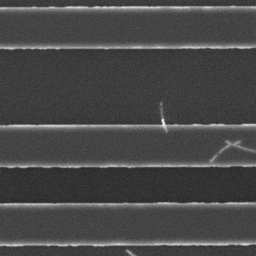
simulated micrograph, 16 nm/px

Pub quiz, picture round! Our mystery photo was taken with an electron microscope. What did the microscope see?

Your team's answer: lines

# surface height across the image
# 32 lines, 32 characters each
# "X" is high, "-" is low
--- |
--------------------------------
XXXXXXXXXXXXXXXXXXXXXXXXXXXXXXXX
XXXXXXXXXXXXXXXXXXXXXXXXXXXXXXXX
XXXXXXXXXXXXXXXXXXXXXXXXXXXXXXXX
XXXXXXXXXXXXXXXXXXXXXXXXXXXXXXXX
XXXXXXXXXXXXXXXXXXXXXXXXXXXXXXXX
--------------------------------
--------------------------------
--------------------------------
--------------------------------
--------------------------------
--------------------------------
--------------------------------
--------------------------------
--------------------------------
--------------------------------
XXXXXXXXXXXXXXXXXXXXXXXXXXXXXXXX
XXXXXXXXXXXXXXXXXXXXXXXXXXXXXXXX
XXXXXXXXXXXXXXXXXXXXXXXXXXXXXXXX
XXXXXXXXXXXXXXXXXXXXXXXXXXXXXXXX
XXXXXXXXXXXXXXXXXXXXXXXXXXXXXXXX
--------------------------------
--------------------------------
--------------------------------
--------------------------------
XXXXXXXXXXXXXXXXXXXXXXXXXXXXXXXX
XXXXXXXXXXXXXXXXXXXXXXXXXXXXXXXX
XXXXXXXXXXXXXXXXXXXXXXXXXXXXXXXX
XXXXXXXXXXXXXXXXXXXXXXXXXXXXXXXX
XXXXXXXXXXXXXXXXXXXXXXXXXXXXXXXX
XXXXXXXXXXXXXXXXXXXXXXXXXXXXXXXX
--------------------------------